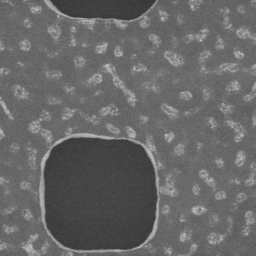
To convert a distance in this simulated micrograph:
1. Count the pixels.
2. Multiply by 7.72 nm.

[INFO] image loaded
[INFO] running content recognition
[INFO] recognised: holes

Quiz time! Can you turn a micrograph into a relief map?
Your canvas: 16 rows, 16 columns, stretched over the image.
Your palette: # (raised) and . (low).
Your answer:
###......#######
################
################
################
################
################
################
################
################
###......#######
###.......######
###.......######
###.......######
###.......######
###......#######
####....########